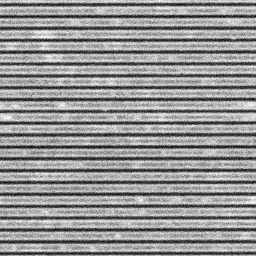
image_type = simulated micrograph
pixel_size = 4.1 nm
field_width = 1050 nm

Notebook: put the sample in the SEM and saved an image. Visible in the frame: parallel lines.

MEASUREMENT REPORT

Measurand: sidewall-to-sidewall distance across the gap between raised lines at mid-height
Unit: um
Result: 0.0159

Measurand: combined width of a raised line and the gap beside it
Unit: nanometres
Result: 48.6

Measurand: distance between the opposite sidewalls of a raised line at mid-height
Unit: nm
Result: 31.3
